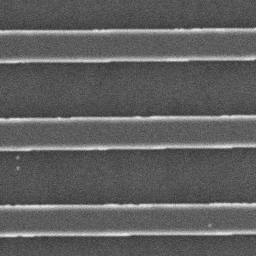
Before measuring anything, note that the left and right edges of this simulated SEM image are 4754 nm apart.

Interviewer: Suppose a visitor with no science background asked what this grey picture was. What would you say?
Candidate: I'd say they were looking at lines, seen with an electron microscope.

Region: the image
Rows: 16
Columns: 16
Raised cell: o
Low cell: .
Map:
................
................
oooooooooooooooo
oooooooooooooooo
................
................
................
oooooooooooooooo
oooooooooooooooo
................
................
................
................
oooooooooooooooo
oooooooooooooooo
................